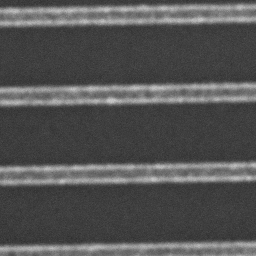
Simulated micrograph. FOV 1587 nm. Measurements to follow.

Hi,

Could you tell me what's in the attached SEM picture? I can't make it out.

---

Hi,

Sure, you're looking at one or a few lines or trenches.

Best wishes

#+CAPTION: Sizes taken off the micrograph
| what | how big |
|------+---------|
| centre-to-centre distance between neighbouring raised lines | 492 nm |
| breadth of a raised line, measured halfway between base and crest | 0.0806 um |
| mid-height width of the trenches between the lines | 411 nm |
